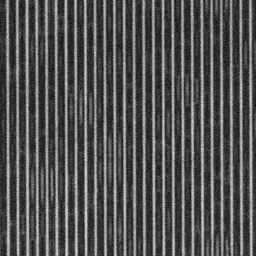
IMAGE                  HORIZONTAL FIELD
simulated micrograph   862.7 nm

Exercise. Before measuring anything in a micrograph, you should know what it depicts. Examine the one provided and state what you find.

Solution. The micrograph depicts parallel lines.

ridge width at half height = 1.87 pixels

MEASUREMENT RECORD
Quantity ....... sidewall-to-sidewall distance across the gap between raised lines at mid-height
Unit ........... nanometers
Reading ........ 24.4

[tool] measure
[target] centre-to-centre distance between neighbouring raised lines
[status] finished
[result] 32.7 nanometres